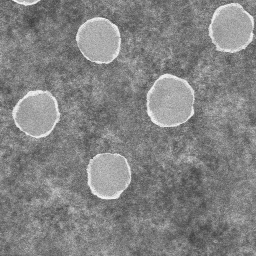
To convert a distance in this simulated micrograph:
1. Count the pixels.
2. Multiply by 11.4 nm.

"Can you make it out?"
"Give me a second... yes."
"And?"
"raised bodies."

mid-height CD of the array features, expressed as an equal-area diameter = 510 nm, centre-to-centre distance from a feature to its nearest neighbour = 1070 nm